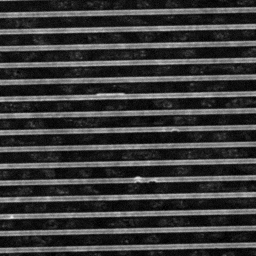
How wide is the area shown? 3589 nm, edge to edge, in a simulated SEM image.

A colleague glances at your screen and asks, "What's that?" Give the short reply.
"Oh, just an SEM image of parallel lines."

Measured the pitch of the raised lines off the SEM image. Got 236 nanometers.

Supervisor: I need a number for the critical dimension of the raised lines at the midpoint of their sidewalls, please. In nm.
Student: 56.1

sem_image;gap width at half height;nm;179